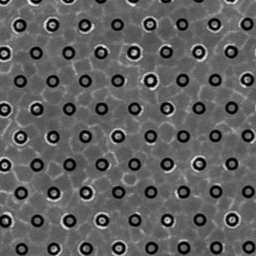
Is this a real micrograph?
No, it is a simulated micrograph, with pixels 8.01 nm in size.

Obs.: a regular array of ring-shaped grooves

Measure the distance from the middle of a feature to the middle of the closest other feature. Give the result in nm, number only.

256